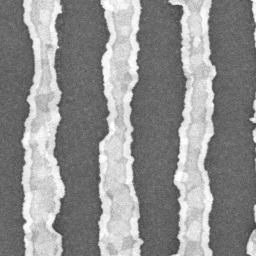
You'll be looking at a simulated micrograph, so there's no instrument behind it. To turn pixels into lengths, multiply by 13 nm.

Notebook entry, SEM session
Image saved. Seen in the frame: one or a few lines or trenches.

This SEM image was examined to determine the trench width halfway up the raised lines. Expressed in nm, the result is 682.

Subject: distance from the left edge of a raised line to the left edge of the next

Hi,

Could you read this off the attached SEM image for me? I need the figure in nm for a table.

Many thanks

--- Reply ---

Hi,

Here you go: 994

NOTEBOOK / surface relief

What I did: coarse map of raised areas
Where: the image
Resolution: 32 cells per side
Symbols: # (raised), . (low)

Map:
...####......####.....####......
...####.......###......##.......
...####.......###......###......
....###.......###......###......
....###.......###......###......
.....##.......###......###......
.....##.......###......###......
.....#.......###.......###......
.....##......####......####.....
.....##......####.......##......
.....##......####.......##......
....###.......##........##......
....###.......##........##......
....###.......##........##......
....###.......##.......###......
....###.......##.......###......
...####.......##.......###......
...###.......###.......###......
....##.......###.......##.......
....##.......###.......##.......
....###......###.......##.......
...####......###.......##.......
...####......###......####......
...####......###.......###......
....###......####......###......
...####......####......###......
...####......####......###......
....##.......####......###......
...###.......####......###......
....###......####......###.....#
....###......####......###.....#
....###......####......###.....#